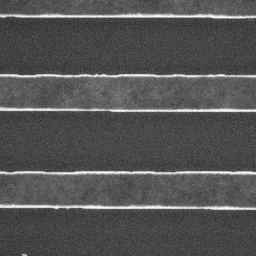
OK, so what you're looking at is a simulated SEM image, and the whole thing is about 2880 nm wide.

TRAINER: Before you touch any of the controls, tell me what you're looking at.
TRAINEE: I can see lines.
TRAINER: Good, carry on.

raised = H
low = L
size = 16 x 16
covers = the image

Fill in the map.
HHHHHHHHHHHHHHHH
LLLLLLLLLLLLLLLL
LLLLLLLLLLLLLLLL
LLLLLLLLLLLLLLLL
LLLLLLLLLLLLLLLL
HHHHHHHHHHHHHHHH
HHHHHHHHHHHHHHHH
LLLLLLLLLLLLLLLL
LLLLLLLLLLLLLLLL
LLLLLLLLLLLLLLLL
LLLLLLLLLLLLLLLL
HHHHHHHHHHHHHHHH
HHHHHHHHHHHHHHHH
LLLLLLLLLLLLLLLL
LLLLLLLLLLLLLLLL
LLLLLLLLLLLLLLLL